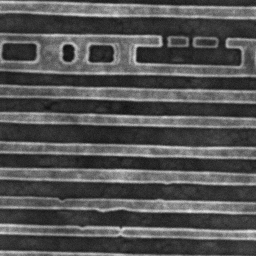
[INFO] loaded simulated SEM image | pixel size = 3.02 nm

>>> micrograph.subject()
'parallel lines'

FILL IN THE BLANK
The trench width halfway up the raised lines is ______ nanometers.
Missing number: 53.6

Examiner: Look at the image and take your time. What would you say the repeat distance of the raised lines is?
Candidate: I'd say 0.0839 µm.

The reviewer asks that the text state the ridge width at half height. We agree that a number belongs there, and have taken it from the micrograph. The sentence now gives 0.031 µm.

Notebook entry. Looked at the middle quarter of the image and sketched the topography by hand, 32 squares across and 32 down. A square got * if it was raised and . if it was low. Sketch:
********************************
********************************
....................***.********
................................
................................
................................
*********************...........
********************************
.......*************************
................................
................................
................................
................................
********************************
********************************
...........................*****
................................
................................
................................
................................
*********************...........
********************************
......**************************
................................
................................
................................
********........................
********************************
********************************
.................***....********
................................
................................